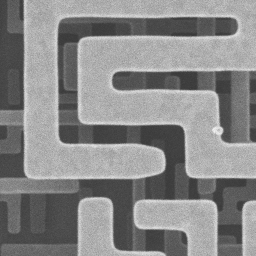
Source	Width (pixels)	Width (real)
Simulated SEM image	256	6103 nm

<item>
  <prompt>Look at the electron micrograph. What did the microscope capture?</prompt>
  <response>wiring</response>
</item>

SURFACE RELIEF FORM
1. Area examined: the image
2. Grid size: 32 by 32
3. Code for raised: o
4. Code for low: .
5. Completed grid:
...ooooooooooooooooooooooooooooo
...ooooooooooooooooooooooooooooo
...ooooo.....................ooo
...oooo.......................oo
...oooo.....................oooo
...oooo...oooooooooooooooooooooo
...oooo...oooooooooooooooooooooo
...oooo...oooooooooooooooooooooo
...oooo...oooooooooooooooooooooo
...oooo...oooo..................
...oooo...oooo..................
...oooo...ooooooooooooooooo.....
...oooo...ooooooooooooooooo.....
...oooo...ooooooooooooooooo.....
...oooo...ooooooooooooooooo.....
...oooo......ooooooooooooooo....
...oooo................ooooo....
...ooooo...............ooooo....
...oooooooooooooooo....ooooooooo
...oooooooooooooooooo..ooooooooo
...oooooooooooooooooo..ooooooooo
...ooooooooooooooooo...ooooooooo
................................
................................
................................
..........oooo...oooooooooo....o
..........oooo...oooooooooo...oo
..........oooo...oooooooooo...oo
..........oooo...oooooooooo...oo
..........oooo.........oooo...oo
..........oooo..........ooo...oo
..........oooooo........ooo...oo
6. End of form